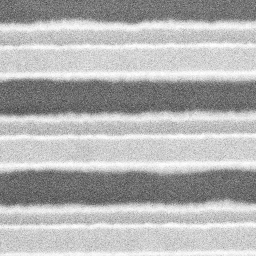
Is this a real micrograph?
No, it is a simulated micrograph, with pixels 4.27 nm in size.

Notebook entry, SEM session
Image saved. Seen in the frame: lines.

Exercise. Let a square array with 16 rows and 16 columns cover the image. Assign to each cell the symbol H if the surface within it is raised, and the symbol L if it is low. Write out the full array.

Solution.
LLLLLLLLLLLLLLLL
LLLLLLLLLLLLLLLL
HHHHHHHHHHHHHHHH
HHHHHHHHHHHHHHHH
HHHHHHHHHHHHHHHH
LLLLLLLLLLLLLLLL
LLLLLLLLLLLLLLLL
HHHHHHHHHHHHHHHH
HHHHHHHHHHHHHHHH
HHHHHHHHHHHHHHHH
LLLLLLLLLLLLLLLL
LLLLLLLLLLLLLLLL
LLLLLLLLLLLLLLLL
HHHHHHHHHHHHHHHH
HHHHHHHHHHHHHHHH
HHHHHHHHHHHHHHHH